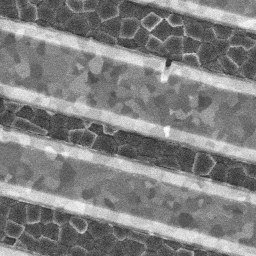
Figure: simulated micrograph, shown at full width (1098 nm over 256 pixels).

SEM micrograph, one or a few lines or trenches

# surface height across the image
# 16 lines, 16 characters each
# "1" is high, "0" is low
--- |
0000000000001111
0000000000000000
1111000000000000
1111111100000000
1111111111110000
1111111111111110
0000111111111111
0000000111111111
0000000000011111
1111000000000001
1111111100000000
1111111111110000
0001111111111111
0000000111111111
0000000000011111
0000000000000001